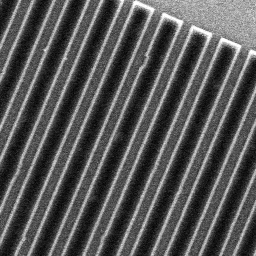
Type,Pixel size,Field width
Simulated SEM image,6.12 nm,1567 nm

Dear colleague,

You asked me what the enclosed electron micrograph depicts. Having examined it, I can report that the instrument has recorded parallel lines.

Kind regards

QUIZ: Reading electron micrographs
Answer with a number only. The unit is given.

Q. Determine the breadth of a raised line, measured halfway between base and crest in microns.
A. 0.12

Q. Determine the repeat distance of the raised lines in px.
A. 31.4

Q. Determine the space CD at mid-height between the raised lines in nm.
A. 72.6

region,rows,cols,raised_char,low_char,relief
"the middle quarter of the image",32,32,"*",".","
..******...*****....*****...****
..*****....*****...*****....****
..*****...******...*****...*****
.******...*****...*****....*****
.*****...******...*****...******
******...*****...******...*****.
*****...******...*****....*****.
*****...******...*****...*****..
*****...*****...*****....*****..
****...******...*****...******..
***....*****...******...*****...
***...******...*****...******...
***...*****...******...*****....
**....*****...*****....*****...*
**...******...*****...*****....*
**...*****...*****....*****...**
*...******...*****...******...**
*...*****...******...*****...***
...******...*****...******...***
...*****....*****...*****....***
...*****...*****....*****...****
..******...*****...*****....****
..*****...******...*****...*****
.******...*****...******...*****
.*****...******...*****...******
******...*****....*****...*****.
******...*****...******...*****.
*****...*****....*****...******.
*****...*****...******...*****..
****...******...*****...******..
****...*****...******...*****...
***...******...*****....*****...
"